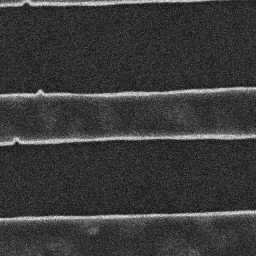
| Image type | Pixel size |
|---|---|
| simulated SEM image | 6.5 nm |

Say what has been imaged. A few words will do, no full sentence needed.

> one or a few lines or trenches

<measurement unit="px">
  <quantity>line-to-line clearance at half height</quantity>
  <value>77.8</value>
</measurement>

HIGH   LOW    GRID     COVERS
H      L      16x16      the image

LLLLLLLLLLLLLLLL
LLLLLLLLLLLLLLLL
LLLLLLLLLLLLLLLL
LLLLLLLLLLLLLLLL
LLLLLLLLLLLLLLLL
LLLLLLLLLLLLLLLL
HHHHHHHHHHHHHHHH
HHHHHHHHHHHHHHHH
HHHHHHHHHHHHHHHH
LLLLLLLLLLLLLLLL
LLLLLLLLLLLLLLLL
LLLLLLLLLLLLLLLL
LLLLLLLLLLLLLLLL
LLLLLLLLHHHHHHHH
HHHHHHHHHHHHHHHH
HHHHHHHHHHHHHHHH